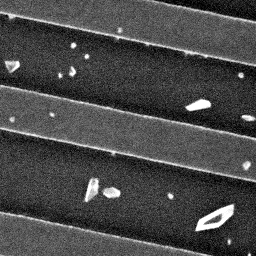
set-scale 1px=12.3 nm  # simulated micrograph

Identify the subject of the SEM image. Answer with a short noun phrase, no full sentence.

lines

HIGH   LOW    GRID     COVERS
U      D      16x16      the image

UUUUUUUUUUUUDDDD
DDDUUUUUUUUUUUUU
DDDDDDDDUUUUUUUU
DDDDDDDDDDDDDUUU
DDDDDDDDDDDDDDDD
UDDDDDDDDDDDDDDD
UUUUUUDDDDDDDDDD
UUUUUUUUUUDDDDDD
DDUUUUUUUUUUUUUD
DDDDDDDUUUUUUUUU
DDDDDDDDDDDDUUUU
DDDDDDDDDDDDDDDD
DDDDDDDDDDDDDDDD
UDDDDDDDDDDDDUDD
UUUUUUDDDDDDDDDD
UUUUUUUUUUUDDDDD